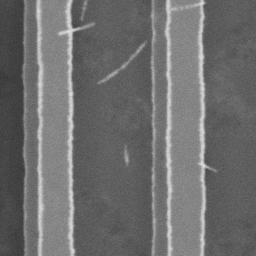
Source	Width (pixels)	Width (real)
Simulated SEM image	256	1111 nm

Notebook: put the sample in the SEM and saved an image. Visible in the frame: lines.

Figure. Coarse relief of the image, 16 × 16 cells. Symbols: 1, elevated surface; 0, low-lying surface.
0011000000111000
0011000000111000
0111000000111000
0011000000111000
0111000000111000
0111000000111000
0011100000111000
0011100000111000
0011000000111000
0111000000111000
0011000000111000
0011000000111000
0011100000111000
0011100000111000
0011100000111000
0011100000111000